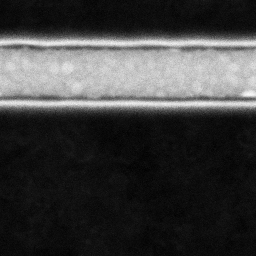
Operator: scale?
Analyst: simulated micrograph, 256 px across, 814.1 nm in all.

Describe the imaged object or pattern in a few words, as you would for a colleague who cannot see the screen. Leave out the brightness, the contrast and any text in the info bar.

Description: one or a few lines or trenches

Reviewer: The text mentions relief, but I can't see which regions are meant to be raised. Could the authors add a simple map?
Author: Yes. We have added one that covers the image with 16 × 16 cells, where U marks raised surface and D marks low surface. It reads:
UUUUUUUUUUUUUUUU
UUUUUUUUUUUUUUUU
UUUUUUUUUUUUUUUU
DDDDDDDDDDDDDDDD
DDDDDDDDDDDDDDDD
DDDDDDDDDDDDDDDD
UUUUUUUUUUUUUUUU
UUUUUUUUUUUUUUUU
UUUUUUUUUUUUUUUU
UUUUUUUUUUUUUUUU
UUUUUUUUUUUUUUUU
UUUUUUUUUUUUUUUU
UUUUUUUUUUUUUUUU
UUUUUUUUUUUUUUUU
UUUUUUUUUUUUUUUU
UUUUUUUUUUUUUUUU